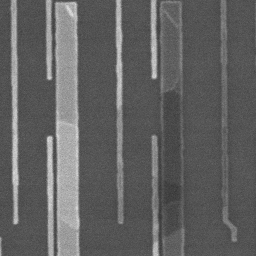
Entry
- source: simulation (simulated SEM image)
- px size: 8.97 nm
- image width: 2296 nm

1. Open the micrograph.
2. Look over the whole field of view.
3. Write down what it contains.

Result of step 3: wiring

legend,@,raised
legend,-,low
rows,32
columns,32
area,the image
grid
-@-----@@-----------@@----------
-@-----@@@----------@@@---------
-------@@@----------@@@---------
-------@@@----------@@@---------
-------@@@----------@@@---------
-------@@@---------@@@@---------
-------@@@---------@@@@---------
-------@@@---------@@@@---------
-------@@@----------@@@---------
-------@@@----------@@@---------
-------@@@----------@@@---------
-------@@@----------@@@---------
-------@@@----------@@@---------
-------@@@----------@@@---------
-------@@@----------@@@---------
-------@@@----------@@@---------
-------@@@----------@@@---------
-------@@@----------@@@---------
-------@@@----------@@@---------
-------@@@----------@@@---------
-------@@@----------@@@---------
------@@@@----------@@@---------
------@@@@----------@@@---------
------@@@@----------@@@---------
------@@@@----------@@@---------
-------@@@---------@@@@---------
-------@@@----------@@@---------
-------@@@----------@@@---------
-------@@@----------@@@---------
-------@@@----------@@@---------
-------@@@----------@@@---------
-------@@@----------@@@---------